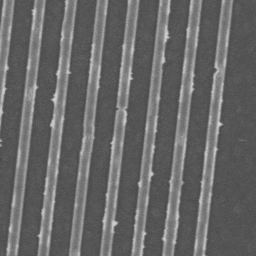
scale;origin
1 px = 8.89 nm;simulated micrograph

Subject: parallel lines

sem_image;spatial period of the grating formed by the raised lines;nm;276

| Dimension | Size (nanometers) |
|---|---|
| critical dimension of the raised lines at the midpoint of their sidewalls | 88.3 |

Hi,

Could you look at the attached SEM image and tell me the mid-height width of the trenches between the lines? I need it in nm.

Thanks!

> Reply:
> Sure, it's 183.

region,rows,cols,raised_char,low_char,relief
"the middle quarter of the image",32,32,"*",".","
*......**.....***.....**......**
*.....***.....***.....**......**
*.....***.....***.....**......**
*.....***.....***.....**......**
*.....***.....**......**......**
*.....***.....**......**.....***
*.....**......**......**.....***
......**......**......**.....***
......**......**......**.....***
......**......**.....***.....**.
......**.....***.....**......**.
.....***......*......**......**.
.....***.....***.....**......**.
.....**......***.....**.....***.
.....**......**......**......**.
.....**......**......**.....***.
.....**......**.....***.....***.
.....**......**......**.....***.
.....**.....***.....***.....***.
.....**.....***.....**......***.
.....**.....***.....***.....**..
....***.....**......**......**..
....**......**......**......**..
....**......**......**......**..
....**......**......**.....***..
....**......**......**.....***..
....**......**......**.....***..
....**......**.....***.....**...
...***.....***.....***.....**...
...***.....***.....**......***..
...***.....**......**......**...
...**......**......**.....***...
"